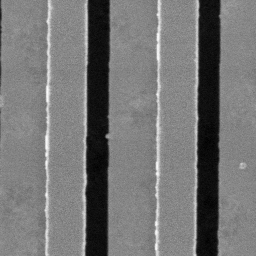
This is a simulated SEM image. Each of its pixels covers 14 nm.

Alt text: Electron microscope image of lines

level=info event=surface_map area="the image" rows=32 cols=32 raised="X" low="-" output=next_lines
XXXXXXXXXXX---XXXXXXXXXXX---XXXX
XXXXXXXXXXX---XXXXXXXXXXX--XXXXX
XXXXXXXXXXX---XXXXXXXXXXX---XXXX
XXXXXXXXXXX---XXXXXXXXXXX---XXXX
XXXXXXXXXXX---XXXXXXXXXXX---XXXX
XXXXXXXXXXX---XXXXXXXXXXX---XXXX
XXXXXXXXXXX---XXXXXXXXXXX---XXXX
XXXXXXXXXXX---XXXXXXXXXXX---XXXX
XXXXXXXXXXX---XXXXXXXXXXX---XXXX
XXXXXXXXXXX---XXXXXXXXXXX---XXXX
XXXXXXXXXXX---XXXXXXXXXXX---XXXX
XXXXXXXXXXX---XXXXXXXXXXX---XXXX
XXXXXXXXXXX---XXXXXXXXXXX---XXXX
XXXXXXXXXXX---XXXXXXXXXXX---XXXX
XXXXXXXXXXX---XXXXXXXXXXX---XXXX
XXXXXXXXXXX---XXXXXXXXXXX---XXXX
XXXXXXXXXXX---XXXXXXXXXXX--XXXXX
XXXXXXXXXXX--XXXXXXXXXXXX--XXXXX
XXXXXXXXXXX---XXXXXXXXXXX--XXXXX
XXXXXXXXXXX---XXXXXXXXXXX--XXXXX
XXXXXXXXXXX---XXXXXXXXXXX--XXXXX
XXXXXXXXXXX---XXXXXXXXXXX--XXXXX
XXXXXXXXXXX---XXXXXXXXXXX--XXXXX
XXXXXXXXXXX---XXXXXXXXXXX--XXXXX
XXXXXXXXXXX---XXXXXXXXXXX--XXXXX
XXXXXXXXXXX---XXXXXXXXXXX--XXXXX
XXXXXXXXXXX---XXXXXXXXXX---XXXXX
XXXXXXXXXXX---XXXXXXXXXX---XXXXX
XXXXXXXXXXX---XXXXXXXXXX---XXXXX
XXXXXXXXXXX---XXXXXXXXXX---XXXXX
XXXXXXXXXXX---XXXXXXXXXX---XXXXX
XXXXXXXXXXX---XXXXXXXXXX---XXXXX